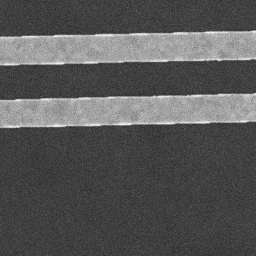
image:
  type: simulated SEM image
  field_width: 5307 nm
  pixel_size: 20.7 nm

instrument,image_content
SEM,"lines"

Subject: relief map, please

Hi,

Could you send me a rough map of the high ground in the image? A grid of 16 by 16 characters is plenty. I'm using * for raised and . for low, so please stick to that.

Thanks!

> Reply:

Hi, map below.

................
................
****************
****************
................
................
****************
****************
................
................
................
................
................
................
................
................